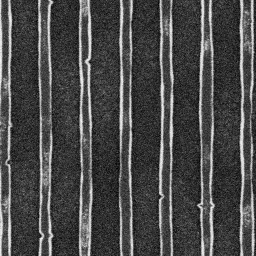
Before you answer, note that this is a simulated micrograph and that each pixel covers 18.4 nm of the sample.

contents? parallel lines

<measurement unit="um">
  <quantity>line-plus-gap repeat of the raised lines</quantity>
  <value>0.741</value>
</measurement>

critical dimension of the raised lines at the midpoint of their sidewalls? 179 nm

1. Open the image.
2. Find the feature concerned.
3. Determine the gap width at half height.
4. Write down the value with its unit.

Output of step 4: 553 nm